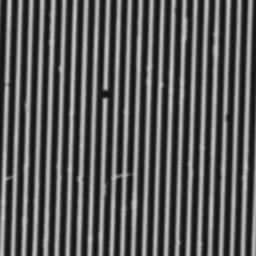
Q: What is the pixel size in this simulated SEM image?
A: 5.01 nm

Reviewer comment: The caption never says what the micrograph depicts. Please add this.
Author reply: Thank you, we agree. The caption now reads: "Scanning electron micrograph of parallel lines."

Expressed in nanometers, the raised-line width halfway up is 23.8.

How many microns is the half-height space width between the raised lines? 0.0325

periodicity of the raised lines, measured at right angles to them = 54.8 nanometers